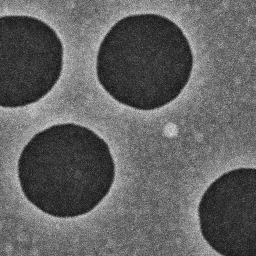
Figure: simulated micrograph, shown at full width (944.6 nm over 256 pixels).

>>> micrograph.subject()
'holes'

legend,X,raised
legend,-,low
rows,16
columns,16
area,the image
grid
XXXXXXXXXXXXXXXX
---XXXX----XXXXX
----XX------XXXX
----XX------XXXX
----XX------XXXX
---XXX------XXXX
--XXXXXX--XXXXXX
XXXXXXXXXXXXXXXX
XX----XXXXXXXXXX
X------XXXXXXXXX
X------XXXXXXXX-
X------XXXXXX---
XX----XXXXXXX---
XXX--XXXXXXX----
XXXXXXXXXXXXX---
XXXXXXXXXXXXX---